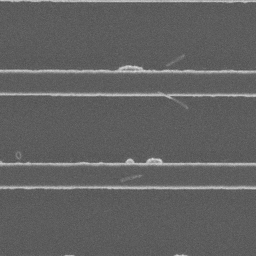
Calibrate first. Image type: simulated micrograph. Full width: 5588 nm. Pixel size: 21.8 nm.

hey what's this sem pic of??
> lines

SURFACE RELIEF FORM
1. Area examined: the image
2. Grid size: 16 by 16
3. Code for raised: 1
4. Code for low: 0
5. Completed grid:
0000000000000000
0000000000000000
0000000000000000
0000000000000000
1111111111111111
1111111111111111
0000000000000000
0000000000000000
0000000000000000
0000000000000000
1111111111111111
1111111111111111
0000000000000000
0000000000000000
0000000000000000
0000000000000000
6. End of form